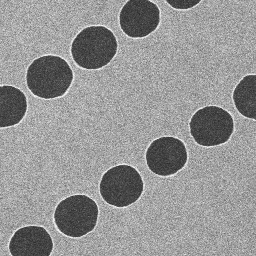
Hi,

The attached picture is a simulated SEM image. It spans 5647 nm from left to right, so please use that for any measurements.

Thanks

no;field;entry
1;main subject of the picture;holes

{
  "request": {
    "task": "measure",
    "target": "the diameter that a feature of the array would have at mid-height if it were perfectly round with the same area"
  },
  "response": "946 nm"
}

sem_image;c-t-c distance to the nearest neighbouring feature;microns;1.19